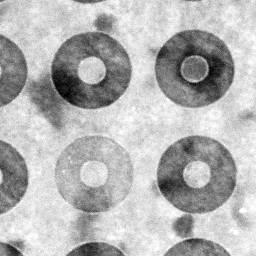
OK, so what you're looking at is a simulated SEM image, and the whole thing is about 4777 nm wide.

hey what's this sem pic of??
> ring-shaped grooves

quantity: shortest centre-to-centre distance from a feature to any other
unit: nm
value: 1920